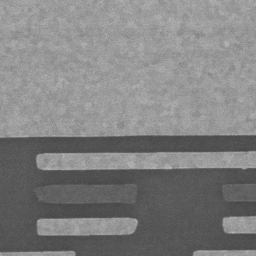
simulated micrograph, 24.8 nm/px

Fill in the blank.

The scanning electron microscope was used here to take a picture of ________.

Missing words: wiring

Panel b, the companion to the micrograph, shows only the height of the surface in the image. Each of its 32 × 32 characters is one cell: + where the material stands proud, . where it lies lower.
++++++++++++++++++++++++++++++++
++++++++++++++++++++++++++++++++
++++++++++++++++++++++++++++++++
++++++++++++++++++++++++++++++++
++++++++++++++++++++++++++++++++
++++++++++++++++++++++++++++++++
++++++++++++++++++++++++++++++++
++++++++++++++++++++++++++++++++
++++++++++++++++++++++++++++++++
++++++++++++++++++++++++++++++++
++++++++++++++++++++++++++++++++
++++++++++++++++++++++++++++++++
++++++++++++++++++++++++++++++++
++++++++++++++++++++++++++++++++
++++++++++++++++++++++++++++++++
++++++++++++++++++++++++++++++++
++++++++++++++++++++++++++++++++
................................
................................
.....+++++++++++++++++++++++++++
.....+++++++++++++++++++++++++++
................................
................................
.....++++++++++++...........++++
.....++++++++++++...........++++
................................
................................
.....++++++++++++...........++++
.....++++++++++++...........++++
................................
................................
.....++++...............++++++++